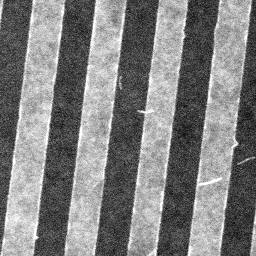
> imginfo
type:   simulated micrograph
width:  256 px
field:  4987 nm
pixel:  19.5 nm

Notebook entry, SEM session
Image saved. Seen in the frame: one or a few lines or trenches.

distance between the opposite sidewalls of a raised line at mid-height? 591 nm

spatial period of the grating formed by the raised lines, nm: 1200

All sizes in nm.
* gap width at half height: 627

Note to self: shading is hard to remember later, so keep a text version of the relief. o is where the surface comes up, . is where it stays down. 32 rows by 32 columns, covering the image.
....oooo....oooo....ooo....oooo.
....oooo....oooo....ooo....oooo.
....oooo....ooo.....ooo....oooo.
....oooo....ooo.....ooo....oooo.
....oooo....ooo....oooo....oooo.
....ooo....oooo....oooo....oooo.
...oooo....oooo....oooo....oooo.
...oooo....oooo....oooo....ooo..
...oooo....oooo....ooo....oooo..
...oooo....oooo....ooo....oooo..
...oooo....ooo.....ooo....oooo..
...oooo....ooo.....ooo....oooo..
...oooo....ooo....oooo....oooo..
...ooo....oooo....oooo....oooo..
..oooo....oooo....oooo....oooo..
..oooo....oooo....oooo....oooo..
..oooo....oooo....ooo....oooo...
..oooo....oooo....ooo....oooo...
..oooo....ooo.....ooo....oooo...
..oooo....ooo.....ooo....oooo...
..oooo....ooo....oooo....oooo...
.oooo....oooo....oooo....oooo...
.oooo....oooo....oooo....oooo...
.oooo....oooo....ooo.....ooo....
.oooo....oooo....ooo....oooo....
.oooo....oooo....ooo....oooo....
.oooo....ooo.....ooo....oooo....
.oooo....ooo.....ooo....oooo....
.oooo....ooo....oooo....oooo....
.oooo...oooo....oooo....oooo....
oooo....oooo....oooo....oooo....
oooo....oooo....oooo....ooo....o